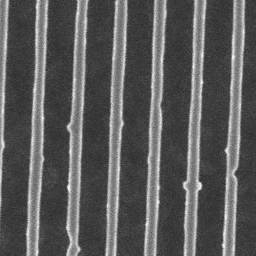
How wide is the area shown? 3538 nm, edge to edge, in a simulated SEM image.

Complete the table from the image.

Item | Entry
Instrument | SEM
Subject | parallel lines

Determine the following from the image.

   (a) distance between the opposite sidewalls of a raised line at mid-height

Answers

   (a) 147 nm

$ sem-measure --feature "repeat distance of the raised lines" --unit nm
543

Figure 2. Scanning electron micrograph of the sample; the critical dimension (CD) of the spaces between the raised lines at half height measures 0.4 microns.